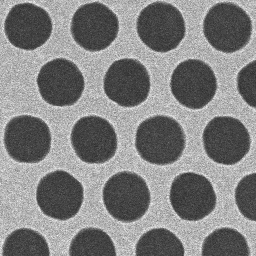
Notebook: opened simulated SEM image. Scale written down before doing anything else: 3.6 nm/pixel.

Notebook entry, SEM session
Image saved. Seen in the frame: a regular array of holes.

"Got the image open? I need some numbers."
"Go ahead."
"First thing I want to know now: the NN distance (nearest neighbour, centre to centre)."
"235 nanometers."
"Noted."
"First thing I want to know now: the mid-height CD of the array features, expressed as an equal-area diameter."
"0.171 micrometres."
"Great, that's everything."